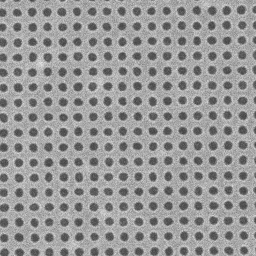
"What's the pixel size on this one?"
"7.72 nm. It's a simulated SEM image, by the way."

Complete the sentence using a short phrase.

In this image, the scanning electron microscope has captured a regular array of holes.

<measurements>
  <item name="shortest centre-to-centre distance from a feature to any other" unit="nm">112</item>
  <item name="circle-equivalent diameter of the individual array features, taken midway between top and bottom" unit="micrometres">0.0745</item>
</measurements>